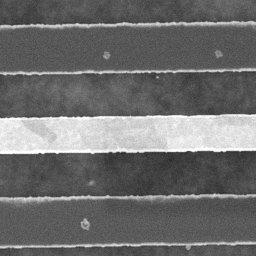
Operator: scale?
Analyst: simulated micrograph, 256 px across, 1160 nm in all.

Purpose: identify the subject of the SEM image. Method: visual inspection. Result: lines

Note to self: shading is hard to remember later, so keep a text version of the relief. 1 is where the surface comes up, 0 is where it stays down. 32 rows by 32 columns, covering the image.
00000000000000000000000000000000
00000000000000000000000000000000
00000000000000000000000000000000
11111111111111111111111111111111
11111111111111111111111111111111
11111111111111111111111111111111
11111111111111111111111111111111
11111111111111111111111111111111
11111111111111111111111111111111
00000000000000000000000000000000
00000000000000000000000000000000
00000000000000000000000000000000
00000000000000000000000000000000
00000000000000000000000000000000
00000000000000000000000000011111
11111111111111111111111111111111
11111111111111111111111111111111
11111111111111111111111111111111
11111111111111111111111111111111
00000000000000000000000000000000
00000000000000000000000000000000
00000000000000000000000000000000
00000000000000000000000000000000
00000000000000000000000000000000
00000000000101001011111111111111
11111111111111111111111111111111
11111111111111111111111111111111
11111111111111111111111111111111
11111111111111111111111111111111
11111111111111111111111111111111
11111111111111111111111111011100
00000000000000000000000000000000